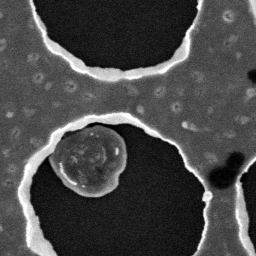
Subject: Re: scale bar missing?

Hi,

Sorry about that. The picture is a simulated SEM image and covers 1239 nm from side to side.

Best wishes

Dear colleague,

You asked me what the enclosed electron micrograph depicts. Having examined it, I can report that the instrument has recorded holes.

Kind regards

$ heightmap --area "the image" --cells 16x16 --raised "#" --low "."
##..........####
###.........####
###.........####
####.......#####
######..########
################
################
################
####......######
###........#####
##..........####
##...........##.
##...........##.
##...........##.
##...........##.
###.........####